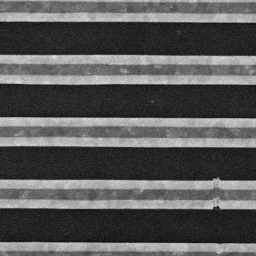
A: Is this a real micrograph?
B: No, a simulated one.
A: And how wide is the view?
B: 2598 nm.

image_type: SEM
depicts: parallel lines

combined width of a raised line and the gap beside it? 633 nm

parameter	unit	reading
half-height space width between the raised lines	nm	416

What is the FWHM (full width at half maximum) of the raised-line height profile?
221 nm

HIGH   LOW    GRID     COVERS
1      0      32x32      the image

11111111111111111111111111111111
11111111111111111111111111111111
00000000000000000000000000000000
00000000000000000000000000000000
00000000000000000000000000000000
00000000000000000000000000000000
00000000000000000000000000000000
11111111111111111111111111100000
11111111111111111111111111111111
11111111111111111111111111111111
00000000000000000000000000000000
00000000000000000000000000000000
00000000000000000000000000000000
00000000000000000000000000000000
00000000000000000000000000000000
11111111111111111111111111111111
11111111111111111111111111111111
11111111111111111111111111111111
00000000000000000000000000000000
00000000000000000000000000000000
00000000000000000000000000000000
00000000000000000000000000000000
00000000000000000000000000000000
11111111111111111111111111111111
11111111111111111111111111111111
01111111111111111111111111111111
00000000000000000000000000000000
00000000000000000000000000000000
00000000000000000000000000000000
00000000000000000000000000000000
00000000000000000000000000000000
11111111111111111111111111111111